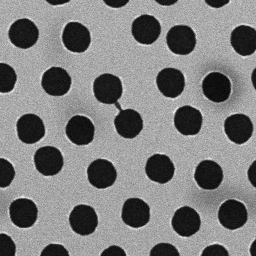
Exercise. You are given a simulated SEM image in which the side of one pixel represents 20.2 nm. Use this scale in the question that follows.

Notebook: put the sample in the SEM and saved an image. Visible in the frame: a regular array of holes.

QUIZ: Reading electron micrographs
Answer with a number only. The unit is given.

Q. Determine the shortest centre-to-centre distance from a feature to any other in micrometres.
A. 0.936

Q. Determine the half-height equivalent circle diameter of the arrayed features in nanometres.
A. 607